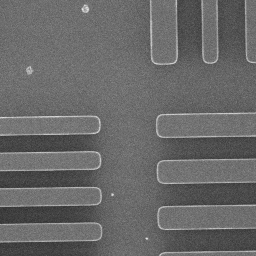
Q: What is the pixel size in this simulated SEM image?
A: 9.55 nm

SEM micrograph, groups of lines, slits or small figures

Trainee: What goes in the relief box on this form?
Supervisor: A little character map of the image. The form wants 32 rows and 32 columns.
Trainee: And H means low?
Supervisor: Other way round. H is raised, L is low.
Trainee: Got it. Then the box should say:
LLLLLLLLLLLLLLLLLLLHHHLLLHHLLLLH
LLLLLLLLLLLLLLLLLLLHHHLLLHHLLLLH
LLLLLLLLLLLLLLLLLLLHHHLLLHHLLLLH
LLLLLLLLLLLLLLLLLLLHHHLLLHHLLLLH
LLLLLLLLLLLLLLLLLLLHHHLLLHHLLLLH
LLLLLLLLLLLLLLLLLLLHHHLLLHHLLLLH
LLLLLLLLLLLLLLLLLLLHHHLLLHHLLLLH
LLLLLLLLLLLLLLLLLLLHHHLLLHHLLLLH
LLLLLLLLLLLLLLLLLLLLLLLLLLLLLLLL
LLLLLLLLLLLLLLLLLLLLLLLLLLLLLLLL
LLLLLLLLLLLLLLLLLLLLLLLLLLLLLLLL
LLLLLLLLLLLLLLLLLLLLLLLLLLLLLLLL
LLLLLLLLLLLLLLLLLLLLLLLLLLLLLLLL
LLLLLLLLLLLLLLLLLLLLLLLLLLLLLLLL
LLLLLLLLLLLLLLLLLLLLHHHHHHHHHHHH
HHHHHHHHHHHHLLLLLLLLHHHHHHHHHHHH
HHHHHHHHHHHHLLLLLLLLHHHHHHHHHHHH
LLLLLLLLLLLLLLLLLLLLLLLLLLLLLLLL
LLLLLLLLLLLLLLLLLLLLLLLLLLLLLLLL
HHHHHHHHHHHHLLLLLLLLLLLLLLLLLLLL
HHHHHHHHHHHHHLLLLLLLHHHHHHHHHHHH
LLLLLLLLLLLLLLLLLLLLHHHHHHHHHHHH
LLLLLLLLLLLLLLLLLLLLHHHHHHHHHHHH
LLLLLLLLLHHHLLLLLLLLLLLLLLLLLLLL
HHHHHHHHHHHHHLLLLLLLLLLLLLLLLLLL
HHHHHHHHHHHHLLLLLLLLLLLLLLLLLLLL
LLLLLLLLLLLLLLLLLLLLHHHHHHHHHHHH
LLLLLLLLLLLLLLLLLLLLHHHHHHHHHHHH
HHHHHHHHHHHHHLLLLLLLHHHHHHHHHLLL
HHHHHHHHHHHHHLLLLLLLLLLLLLLLLLLL
LLLLLLLLLLLLLLLLLLLLLLLLLLLLLLLL
LLLLLLLLLLLLLLLLLLLLLLLHHHHHHHHH